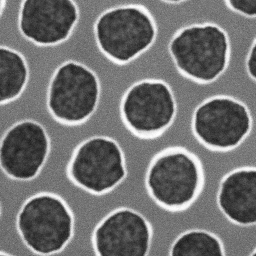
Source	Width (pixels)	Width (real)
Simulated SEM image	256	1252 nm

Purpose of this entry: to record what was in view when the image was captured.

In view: a regular array of holes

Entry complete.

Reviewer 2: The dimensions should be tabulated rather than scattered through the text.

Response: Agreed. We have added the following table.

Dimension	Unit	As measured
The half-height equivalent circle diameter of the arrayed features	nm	262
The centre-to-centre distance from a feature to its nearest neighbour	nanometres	368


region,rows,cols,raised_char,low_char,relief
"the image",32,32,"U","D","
UUUDDDDDDUUUUUUUUUUUUUUUUUUUUDDD
UUUDDDDDDDUUUUDDDDUUUUUUUUUUUUDD
UUUDDDDDDUUUDDDDDDDUUUUUUUUUUUUU
UUUDDDDDDUUUDDDDDDDUUUUUDDDUUUUU
UUUDDDDDUUUUDDDDDDDUUUDDDDDDUUUU
UUUUUUUUUUUUDDDDDDDUUDDDDDDDUUUU
DDUUUUUUUUUUUDDDDUUUUDDDDDDDUUUD
DDDUUUUUUUUUUUUDUUUUUUDDDDDDUUUD
DDDUUUUUDDUUUUUUUUUUUUUDDDDDUUUD
DDDUUUUDDDDDUUUUUUUUUUUUDDDUUUUU
DDDUUUDDDDDDUUUUUDDDUUUUUUUUUUUU
DDUUUUDDDDDDUUUUDDDDDUUUUUUUUUUU
DUUUUUDDDDDDUUUUDDDDDDUUUUUDDUUU
UUUUUUDDDDDDUUUDDDDDDDUUUDDDDDDU
UUUUUUUDDDDUUUUUDDDDDDUUDDDDDDDU
UUDDUUUUUUUUUUUUDDDDDUUUDDDDDDDU
UDDDDUUUUUUUUUUUUDDUUUUUDDDDDDDU
DDDDDDUUUUUDDUUUUUUUUUUUUDDDDDUU
DDDDDDUUUUDDDDDUUUUUUUUUUUUUUUUU
DDDDDDUUUUDDDDDUUUUUDDDDUUUUUUUU
DDDDDUUUUDDDDDDUUUUDDDDDDUUUUUUU
UDDDDUUUUDDDDDDDUUUDDDDDDUUUUUDD
UUUUUUUUUDDDDDDUUUDDDDDDDUUUDDDD
UUUUUUUUUUUDDDUUUUUDDDDDDUUUDDDD
UUUUUDUUUUUUUUUUUUUDDDDDUUUDDDDD
UUUDDDDDUUUUUUUUUUUUUDDUUUUUDDDD
UUUDDDDDUUUUUUDDUUUUUUUUUUUUDDDD
UUDDDDDDDUUUUDDDDDUUUUUUUUUUUDDD
UUDDDDDDDUUUDDDDDDUUUUUUUUUUUUUU
UUUDDDDDDUUUDDDDDDDUUUUDDDDUUUUU
UUUUDDDDUUUUDDDDDDDUUUDDDDDUUUUU
UUUUUDUUUUUUDDDDDDUUUDDDDDDDUUUU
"